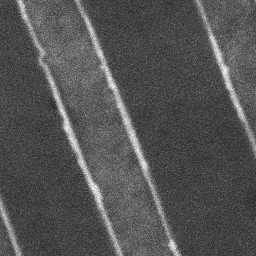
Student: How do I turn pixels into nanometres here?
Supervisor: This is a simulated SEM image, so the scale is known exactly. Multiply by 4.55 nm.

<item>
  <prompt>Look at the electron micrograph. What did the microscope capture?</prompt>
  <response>one or a few lines or trenches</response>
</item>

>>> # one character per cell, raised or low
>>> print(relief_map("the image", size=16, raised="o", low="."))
oo...oooooooo...
oo...oooooooo...
oo....ooooooo...
ooo...oooooooo..
ooo....ooooooo..
ooo....ooooooo..
oooo...oooooooo.
oooo....ooooooo.
ooooo...oooooooo
ooooo....ooooooo
ooooo....ooooooo
oooooo...ooooooo
oooooo....oooooo
ooooooo...oooooo
.oooooo...oooooo
.oooooo....ooooo